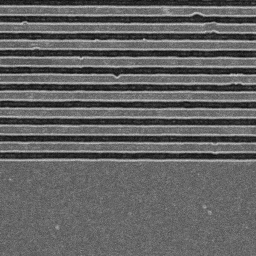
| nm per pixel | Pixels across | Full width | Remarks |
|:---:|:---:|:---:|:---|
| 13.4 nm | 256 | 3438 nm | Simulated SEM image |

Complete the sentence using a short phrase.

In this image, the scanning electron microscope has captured parallel lines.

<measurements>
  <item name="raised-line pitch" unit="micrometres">0.229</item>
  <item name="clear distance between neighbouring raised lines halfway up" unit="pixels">7.25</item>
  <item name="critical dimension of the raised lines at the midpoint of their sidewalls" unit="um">0.131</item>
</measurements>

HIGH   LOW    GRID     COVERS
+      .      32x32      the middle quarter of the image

+++.+...++++++++++++++++++++++++
................................
................................
++++++++++++++++++++++++++++++++
++++++++++++++++++++++++++++++++
................................
................................
++++++++++++++++++++++++++++++++
++++++++++++++++++++++++++++++++
................................
................................
++++++++++++++++++++++++++++++++
++++++++++++++++++++++++++++++++
...........................+++++
................................
+...++++++++++++++..............
++++++++++++++++++++++++++++++++
++++++++++++++++++++++++++++++++
................................
................................
++++++++++++++++++++++++++++++++
++++++++++++++++++++++++++++++++
................................
................................
++++++++++++++++++++++++++++++++
++++++++++++++++++++++++++++++++
++++++++++++++++++++++++++++++++
++++++++++++++++++++++++++++++++
++++++++++++++++++++++++++++++++
++++++++++++++++++++++++++++++++
++++++++++++++++++++++++++++++++
++++++++++++++++++++++++++++++++